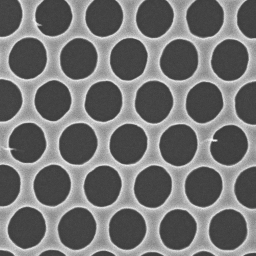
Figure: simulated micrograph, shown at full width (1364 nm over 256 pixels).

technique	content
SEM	a regular array of holes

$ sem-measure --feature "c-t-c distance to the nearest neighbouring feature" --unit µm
0.262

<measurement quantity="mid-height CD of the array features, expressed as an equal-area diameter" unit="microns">0.209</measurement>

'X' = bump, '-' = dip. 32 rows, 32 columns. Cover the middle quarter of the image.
--------XXXX---------XXX--------
--------XXXX--------XXXX--------
-------XXXXXX-------XXXXX-------
X----XXXXXXXXX----XXXXXXXX-----X
XXXXXXXXX---XXXXXXXXX---XXXXXXXX
XXXXXXX------XXXXXXX------XXXXXX
-XXXXX--------XXXXX--------XXXXX
-XXXXX--------XXXX---------XXXX-
--XXX----------XXX---------XXXX-
--XXX----------XXX---------XXXX-
--XXX----------XXX---------XXX--
-XXXX---------XXXX---------XXXX-
XXXXXX--------XXXXX-------XXXXX-
XXXXXXX------XXXXXX------XXXXXXX
XXXXXXXXX-XXXXXXXXXXX---XXXXXXXX
X-----XXXXXXXX----XXXXXXXXX----X
-------XXXXXX-------XXXXXX------
--------XXXX--------XXXXX-------
--------XXXX---------XXX--------
--------XXX----------XXX--------
--------XXX----------XXX--------
--------XXX----------XXX--------
--------XXXX--------XXXX--------
-------XXXXXX------XXXXXX-------
X----XXXXXXXXX----XXXXXXX------X
XXXXXXXXX--XXXXXXXXXX---XXXX--XX
XXXXXXX------XXXXXXX-----XXXXXXX
-XXXXX--------XXXXX-------XXXXX-
-XXXX---------XXXX---------XXXX-
--XXX---------XXXX---------XXX--
--XXX---------XXXX---------XXX--
-XXXX---------XXX----------XXX--